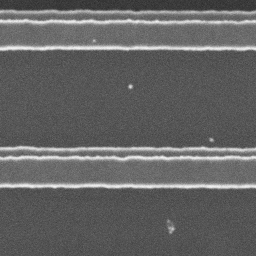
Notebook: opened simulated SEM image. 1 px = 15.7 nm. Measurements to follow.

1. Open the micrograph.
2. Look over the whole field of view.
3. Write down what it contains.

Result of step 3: lines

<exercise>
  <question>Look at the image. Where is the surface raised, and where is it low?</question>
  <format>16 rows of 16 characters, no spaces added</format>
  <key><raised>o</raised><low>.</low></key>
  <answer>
................
oooooooooooooooo
oooooooooooooooo
................
................
................
................
................
................
oooooooooooooooo
oooooooooooooooo
oooooooooooooooo
................
................
................
................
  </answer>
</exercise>